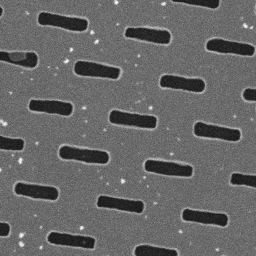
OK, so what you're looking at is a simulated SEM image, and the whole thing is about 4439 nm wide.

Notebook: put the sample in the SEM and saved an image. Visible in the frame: a regular array of holes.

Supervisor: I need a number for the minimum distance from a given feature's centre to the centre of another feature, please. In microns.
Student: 1.03